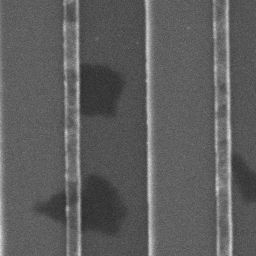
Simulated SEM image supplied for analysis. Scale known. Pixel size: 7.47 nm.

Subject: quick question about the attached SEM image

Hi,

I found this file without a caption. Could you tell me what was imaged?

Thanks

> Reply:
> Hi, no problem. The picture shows lines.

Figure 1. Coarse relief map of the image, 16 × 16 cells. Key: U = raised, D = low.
UUUUUDDDDUUUUUDD
UUUUUDDDDUUUUUDD
UUUUUDDDDUUUUUDD
UUUUUDDDDUUUUUDD
UUUUUDDDDUUUUUDD
UUUUUDDDDUUUUUDD
UUUUUDDDDUUUUUDD
UUUUUDDDDUUUUUDD
UUUUUDDDDUUUUUDD
UUUUUDDDDUUUUUDD
UUUUUDDDDUUUUUDD
UUUUUDDDDUUUUUDD
UUUUUDDDDUUUUUDD
UUUUUDDDDUUUUUDD
UUUUUDDDDUUUUUDD
UUUUUDDDDUUUUUDD